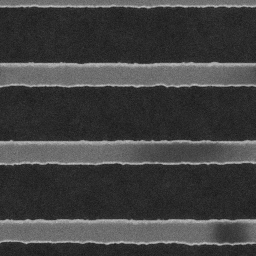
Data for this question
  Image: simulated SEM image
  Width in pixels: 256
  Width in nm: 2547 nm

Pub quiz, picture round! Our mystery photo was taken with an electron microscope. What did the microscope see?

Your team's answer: lines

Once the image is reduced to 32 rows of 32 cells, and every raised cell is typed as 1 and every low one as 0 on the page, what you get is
11111111111111111111111111111111
00000000000000000000000000000000
00000000000000000000000000000000
00000000000000000000000000000000
00000000000000000000000000000000
00000000000000000000000000000000
00000000000000000000000000000000
00000000000000000000000000000000
11111111111111111111111111111111
11111111111111111111111111111111
11111111111111111111111111111111
00000000000000000000000000000000
00000000000000000000000000000000
00000000000000000000000000000000
00000000000000000000000000000000
00000000000000000000000000000000
00000000000000000000000000000000
00000000000000000000000000000000
11111111111111111111111111111111
11111111111111111111111111111111
11100101111110011100111111111000
00000000000000000000000000000000
00000000000000000000000000000000
00000000000000000000000000000000
00000000000000000000000000000000
00000000000000000000000000000000
00000000000000000000000000000000
10011101110011110000011110111111
11111111111111111111111111111111
11111111111111111111111111111111
00000000000001000110000111111110
00000000000000000000000000000000